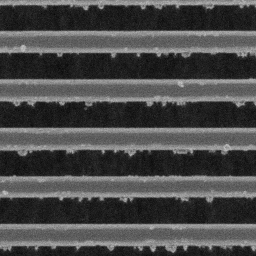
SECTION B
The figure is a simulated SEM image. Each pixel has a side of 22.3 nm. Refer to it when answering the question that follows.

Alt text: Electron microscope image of lines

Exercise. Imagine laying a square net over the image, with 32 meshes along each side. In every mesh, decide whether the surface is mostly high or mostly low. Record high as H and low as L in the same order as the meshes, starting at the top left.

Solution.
LLLLLLLLLLLLLLLLLLLLLLLLLLLLLLLL
LLLLLLLLLLLLLLLLLLLLLLLLLLLLLLLL
LLLLLLLLLLLLLLLLLLLLLLLLLLLLLLLL
LLLLLLLLLLLLLLLLLLLLLLLLLLLLLLLL
HHHHHHHHHHHHHHHHHHHHHHHHHHHHHHHH
HHHHHHHHHHHHHHHHHHHHHHHHHHHHHHHH
LLLLLLLLLLLLLLLLLLLLLLLLLLLLLLLL
LLLLLLLLLLLLLLLLLLLLLLLLLLLLLLLL
LLLLLLLLLLLLLLLLLLLLLLLLLLLLLLLL
LLLLLLLLLLLLLLLLLLLLLLLLLLLLLLLL
HHHHHHHHHHHHHHHHHHHHHHHHHHHHHHHH
HHHHHHHHHHHHHHHHHHHHHHHHHHHHHHHH
LLLLLLLLLLLLLLLLLLLLLLLLLLLLLLLL
LLLLLLLLLLLLLLLLLLLLLLLLLLLLLLLL
LLLLLLLLLLLLLLLLLLLLLLLLLLLLLLLL
LLLLLLLLLLLLLLLLLLLLLLLLLLLLLLLL
HHHHHHHHHHHHHHHHHHHHHHHHHHHHHHHH
HHHHHHHHHHHHHHHHHHHHHHHHHHHHHHHH
HHHHHHHLHLLLLLLHLLLLLLLHLLHHHHHH
LLLLLLLLLLLLLLLLLLLLLLLLLLLLLLLL
LLLLLLLLLLLLLLLLLLLLLLLLLLLLLLLL
LLLLLLLLLLLLLLLLLLLLLLLLLLLLLLLL
HHHHHHHHHHHHHHHHHHHHHHHHHHHHHHHH
HHHHHHHHHHHHHHHHHHHHHHHHHHHHHHHH
LLLLLLLLLLLLLLLLLLLLLLLLLLLLLLLL
LLLLLLLLLLLLLLLLLLLLLLLLLLLLLLLL
LLLLLLLLLLLLLLLLLLLLLLLLLLLLLLLL
LLLLLLLLLLLLLLLLLLLLLLLLLLLLLLLL
HHHHHHHHHHHHHHHHHHHHHHHHHHHHHHHH
HHHHHHHHHHHHHHHHHHHHHHHHHHHHHHHH
HLLLLLLHHHHLLLLLHHLLLLLLLLLLLLLL
LLLLLLLLLLLLLLLLLLLLLLLLLLLLLLLL